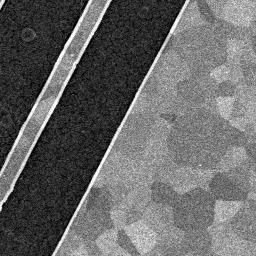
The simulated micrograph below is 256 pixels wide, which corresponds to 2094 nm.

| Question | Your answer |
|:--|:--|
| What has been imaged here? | one or a few lines or trenches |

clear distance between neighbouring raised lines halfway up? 562 nanometers